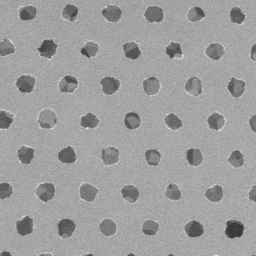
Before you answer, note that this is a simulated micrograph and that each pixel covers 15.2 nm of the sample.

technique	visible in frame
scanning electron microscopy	a regular array of raised bodies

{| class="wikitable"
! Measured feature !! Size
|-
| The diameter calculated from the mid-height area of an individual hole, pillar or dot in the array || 279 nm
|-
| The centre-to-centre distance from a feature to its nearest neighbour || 618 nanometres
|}